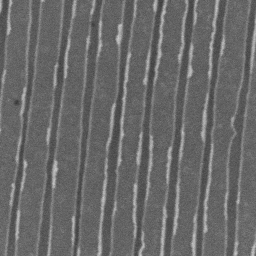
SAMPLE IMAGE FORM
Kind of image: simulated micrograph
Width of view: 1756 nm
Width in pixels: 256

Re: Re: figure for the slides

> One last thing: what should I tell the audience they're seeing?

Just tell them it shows parallel lines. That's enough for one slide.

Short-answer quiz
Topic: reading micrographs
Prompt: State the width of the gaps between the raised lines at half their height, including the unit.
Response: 53.8 nm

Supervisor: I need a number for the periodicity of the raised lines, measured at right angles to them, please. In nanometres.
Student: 211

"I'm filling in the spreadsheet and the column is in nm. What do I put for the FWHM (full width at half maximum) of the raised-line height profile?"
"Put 155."